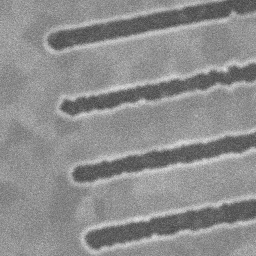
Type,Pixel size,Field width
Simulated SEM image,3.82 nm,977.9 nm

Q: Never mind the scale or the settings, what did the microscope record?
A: one or a few lines or trenches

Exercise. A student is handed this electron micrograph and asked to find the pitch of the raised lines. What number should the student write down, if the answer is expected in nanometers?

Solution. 255